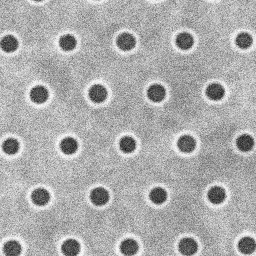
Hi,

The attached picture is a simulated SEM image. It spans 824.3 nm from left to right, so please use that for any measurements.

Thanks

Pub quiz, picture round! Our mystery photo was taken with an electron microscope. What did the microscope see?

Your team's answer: a regular array of holes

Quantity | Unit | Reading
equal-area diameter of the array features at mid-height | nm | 63.7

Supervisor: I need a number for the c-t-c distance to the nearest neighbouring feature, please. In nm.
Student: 188